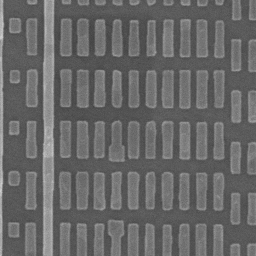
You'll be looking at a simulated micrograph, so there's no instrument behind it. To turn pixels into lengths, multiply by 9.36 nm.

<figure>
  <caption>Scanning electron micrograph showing wiring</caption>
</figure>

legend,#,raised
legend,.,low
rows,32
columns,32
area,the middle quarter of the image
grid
................................
................................
##.###..##..##..##...##..##..##.
##.###..##..##..##...##..##..##.
##.###..##..##..##...##..##..##.
#..###..##..##..##...##..##..##.
#..###..##..##..##...##..##..##.
#..###..##..##..##...##..##..##.
#..###..##..##..###..##..##..##.
#..###..##..##..###..##..##..##.
....##.......#...#...##..##..##.
................................
................................
................................
#..##...##...#...#...#...##.....
#..###..##..##..###..##..##..##.
#..###..##..##..###..##..##..##.
#..###..##..##..###..##..##..##.
#..###..##..##..###..##..##..##.
#..###..##..##..###..##..##..##.
#..###..##..###.###..##..##..##.
#..###..##.####.##...##..##..##.
#..###..##.####.##...##..##..##.
...........####..............##.
................................
................................
................................
#..###..##..##..###..#...##..##.
#..###..##..##..###..##..##..##.
#..###..##..##..##...##..##..##.
#..###..##..##..##...##..##..##.
#..###..##..##..##...##..##..##.